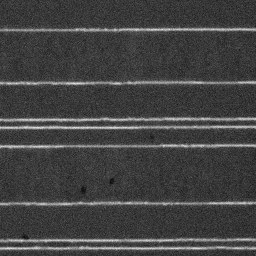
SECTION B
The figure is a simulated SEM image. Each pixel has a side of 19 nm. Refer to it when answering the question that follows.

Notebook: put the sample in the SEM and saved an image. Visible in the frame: lines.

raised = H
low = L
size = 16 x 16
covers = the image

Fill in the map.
LLLLLLLLLLLLLLLL
LLLLLLLLLLLLLLLL
HHHHHHHHHHHHHHHH
HHHHHHHHHHHHHHHH
HHHHHHHHHHHHHHHH
LLLLLLLLLLLLLLLL
LLLLLLLLLLLLLLLL
LLLLLLLLLLHHLLLL
LLLLLLLLLLLLLLLL
HHHHHHHHHHHHHHHH
HHHHHHHHHHHHHHHH
HHHHHHHHHHHHHHHH
HHHHHHHHHHHHHHHH
LLLLLLLLLLLLLLLL
LLLLLLLLLLLLLLLL
LLHHHLLLHHHLLLLL